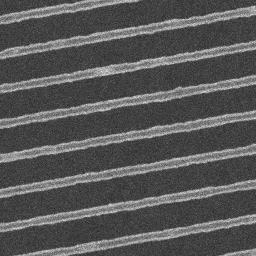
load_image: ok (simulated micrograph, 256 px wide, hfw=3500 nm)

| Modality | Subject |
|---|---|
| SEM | parallel lines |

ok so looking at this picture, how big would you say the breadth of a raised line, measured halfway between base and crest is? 96 nm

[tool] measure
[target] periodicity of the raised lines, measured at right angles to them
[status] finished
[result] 467 nanometers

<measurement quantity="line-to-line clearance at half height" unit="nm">372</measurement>